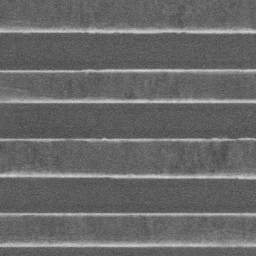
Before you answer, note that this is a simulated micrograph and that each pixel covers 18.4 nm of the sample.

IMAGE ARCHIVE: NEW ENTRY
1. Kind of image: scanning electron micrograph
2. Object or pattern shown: lines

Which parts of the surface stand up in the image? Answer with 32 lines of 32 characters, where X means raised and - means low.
XXXXXXXXXXXXXXXXXXXXXXXXXXXXXXXX
XXXXXXXXXXXXXXXXXXXXXXXXXXXXXXXX
XXXXXXXXXXXXXXXXXXXXXXXXXXXXXXXX
XXXXXXXXXXXXXXXXXXXXXXXXXXXXXXXX
--------------------------------
--------------------------------
--------------------------------
--------------------------------
--------------------------------
XXXXXXXXXXXXXXXXXXXXXXXXXXXXXXXX
XXXXXXXXXXXXXXXXXXXXXXXXXXXXXXXX
XXXXXXXXXXXXXXXXXXXXXXXXXXXXXXXX
XXXXXXXXXXXXXXXXXXXXXXXXXXXXXXXX
--------------------------------
--------------------------------
--------------------------------
--------------------------------
XXXXXXXXXXXXXXXXXXXXXXXXXXXXXXXX
XXXXXXXXXXXXXXXXXXXXXXXXXXXXXXXX
XXXXXXXXXXXXXXXXXXXXXXXXXXXXXXXX
XXXXXXXXXXXXXXXXXXXXXXXXXXXXXXXX
XXXXXXXXXXXXXXXXXXXXXXXXXXXXXXXX
--------------------------------
--------------------------------
--------------------------------
--------------------------------
--------------------------------
XXXXXXXXXXXXXXXXXXXXXXXXXXXXXXXX
XXXXXXXXXXXXXXXXXXXXXXXXXXXXXXXX
XXXXXXXXXXXXXXXXXXXXXXXXXXXXXXXX
XXXXXXXXXXXXXXXXXXXX---XXX------
--------------------------------